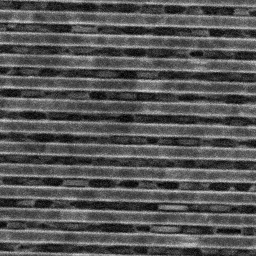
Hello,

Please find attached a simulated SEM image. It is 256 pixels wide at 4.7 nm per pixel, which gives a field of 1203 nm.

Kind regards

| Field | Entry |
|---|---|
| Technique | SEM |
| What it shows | parallel lines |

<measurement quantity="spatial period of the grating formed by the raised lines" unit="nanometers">103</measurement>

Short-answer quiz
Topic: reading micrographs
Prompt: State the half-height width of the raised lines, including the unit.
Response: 51.1 nanometers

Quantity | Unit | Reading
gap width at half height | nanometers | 50.5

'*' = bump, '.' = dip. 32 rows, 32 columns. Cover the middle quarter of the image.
********************************
...............................*
................................
................................
********************************
********************************
.........***********************
................................
................................
************....................
********************************
********************************
...............................*
................................
................................
********************************
********************************
.........***.....***************
................................
................................
*******************.............
********************************
********************************
...............................*
................................
................................
********************************
********************************
.........***********************
................................
................................
******************..............